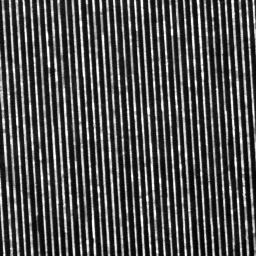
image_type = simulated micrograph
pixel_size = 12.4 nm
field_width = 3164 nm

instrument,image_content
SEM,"parallel lines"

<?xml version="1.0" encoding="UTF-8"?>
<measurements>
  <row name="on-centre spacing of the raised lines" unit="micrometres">0.0858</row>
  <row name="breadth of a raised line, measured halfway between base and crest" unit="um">0.0185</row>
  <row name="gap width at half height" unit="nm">66.3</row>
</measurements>